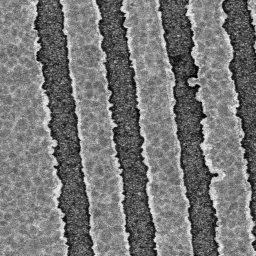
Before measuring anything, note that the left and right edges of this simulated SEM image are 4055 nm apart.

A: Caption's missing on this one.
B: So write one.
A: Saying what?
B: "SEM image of one or a few lines or trenches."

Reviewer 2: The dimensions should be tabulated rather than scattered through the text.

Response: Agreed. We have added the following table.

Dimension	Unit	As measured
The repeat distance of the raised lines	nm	985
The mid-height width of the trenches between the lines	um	0.457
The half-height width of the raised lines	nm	539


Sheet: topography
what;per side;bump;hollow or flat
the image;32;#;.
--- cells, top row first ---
####....####....####....####...#
#####...####....####....####...#
####....####....####....####....
####....####....####....####....
#####...#####...####....####....
#####....####...#####...#####...
#####....####...#####...#####...
#####....####....####...#####...
#####....####....####....####...
#####....####....#####...####...
#####....####....#####..#####...
#####....#####...#####...####...
######...#####...#####...#####..
######...#####...#####...####...
######....####...#####....####..
######....####...#####...#####..
######....####....####....####..
#######...####....####....####..
######....####....####...#####..
#######...####....####....####..
#######...####....####....#####.
#######....####....####....####.
#######....####....####....####.
#######....####....####...#####.
#######....####....####....####.
#######....####....####....####.
########...####....#####...####.
########...#####...#####...####.
########...#####...#####...####.
########....####...#####...####.
########....####....####....####
########....####....####....####